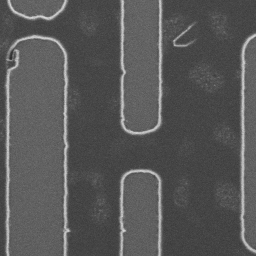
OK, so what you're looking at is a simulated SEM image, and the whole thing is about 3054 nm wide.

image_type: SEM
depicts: one or a few lines or trenches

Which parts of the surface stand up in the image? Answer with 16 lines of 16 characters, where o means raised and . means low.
o...oooo..oooooo
oooooooo..oooooo
o..ooooo..oooooo
o...oooo..ooooo.
o...oooo..ooooo.
o...oooo..ooooo.
o...oooo..ooooo.
o...oooo..ooooo.
o...ooooooooooo.
....ooooooooooo.
....ooooooooooo.
....oooo..ooooo.
....oooo..ooooo.
....oooo..ooooo.
....oooo..ooooo.
....oooo..oooooo